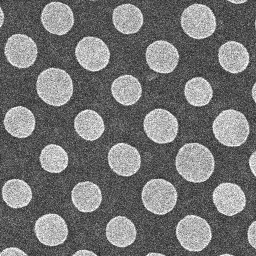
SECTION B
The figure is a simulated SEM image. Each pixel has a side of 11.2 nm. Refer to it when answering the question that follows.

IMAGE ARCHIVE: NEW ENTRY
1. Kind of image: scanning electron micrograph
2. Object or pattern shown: a regular array of raised bodies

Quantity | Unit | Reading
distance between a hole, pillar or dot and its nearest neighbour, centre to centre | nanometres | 549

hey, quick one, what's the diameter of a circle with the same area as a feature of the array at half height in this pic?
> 0.36 µm